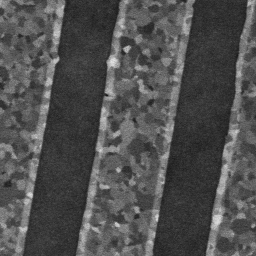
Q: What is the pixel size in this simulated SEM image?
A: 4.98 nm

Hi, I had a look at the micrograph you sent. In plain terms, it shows one or a few lines or trenches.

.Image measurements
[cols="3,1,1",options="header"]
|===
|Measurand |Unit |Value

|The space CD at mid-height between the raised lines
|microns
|0.304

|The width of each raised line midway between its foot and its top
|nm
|333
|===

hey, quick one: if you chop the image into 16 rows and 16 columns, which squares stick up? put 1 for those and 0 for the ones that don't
1111000011110000
1111000011110000
1110000111100001
1110000111100001
1110000111100001
1110000111100001
1110000111100001
1110000111100001
1100001111100001
1100001111000011
1100001111000011
1100001111000011
1100001111000011
1100011111000011
1000011110000111
1000011110000111